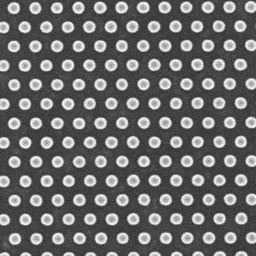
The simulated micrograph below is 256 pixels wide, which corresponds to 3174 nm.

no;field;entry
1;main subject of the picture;a regular array of raised bodies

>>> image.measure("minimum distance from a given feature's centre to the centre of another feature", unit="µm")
0.266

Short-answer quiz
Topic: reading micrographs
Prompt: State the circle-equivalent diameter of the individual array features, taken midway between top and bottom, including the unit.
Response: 139 nm